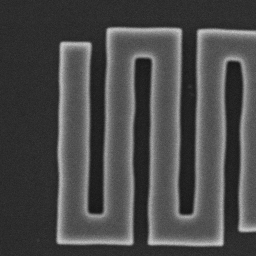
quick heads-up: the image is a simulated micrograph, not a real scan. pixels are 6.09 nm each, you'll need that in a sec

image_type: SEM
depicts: groups of lines, slits or small figures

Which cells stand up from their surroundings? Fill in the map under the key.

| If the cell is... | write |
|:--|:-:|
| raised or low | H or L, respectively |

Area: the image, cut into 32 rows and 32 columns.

LLLLLLLLLLLLLLLLLLLLLLLLLLLLLLLL
LLLLLLLLLLLLLLLLLLLLLLLLLLLLLLLL
LLLLLLLLLLLLLLLLLLLLLLLLLLLLLLLL
LLLLLLLLLLLLLLLLLLLLLLLLLLLLLLLL
LLLLLLLLLLLLLHHHHHHHHHHLLHHHHHHH
LLLLLLLLHHHLLHHHHHHHHHHLLHHHHHHH
LLLLLLLLHHHLLHHHHHHHHHHLLHHHHHHH
LLLLLLLLHHHLLHHHHLLHHHHLLHHHHHHH
LLLLLLLLHHHLLHHHHLLHHHHLLHHHLLHH
LLLLLLLLHHHLLHHHHLLHHHHLLHHHLLHH
LLLLLLLLHHHLLHHHHLLHHHHLLHHHLLHH
LLLLLLLLHHHLLHHHHLLHHHHLLHHHLLHH
LLLLLLLLHHHLLHHHHLLHHHLLLHHHLLHH
LLLLLLLLHHHLLHHHHLLHHHLLLHHHLLHH
LLLLLLLLHHHLLHHHHLLHHHLLLHHHLLHH
LLLLLLLLHHHLLHHHHLLHHHLLLHHHLLHH
LLLLLLLLHHHLLHHHHLLHHHLLLHHHLLHH
LLLLLLLHHHHLLHHHHLLHHHLLLHHHLLHH
LLLLLLLHHHHLLHHHHLLHHHLLLHHHLLHH
LLLLLLLHHHHLLHHHHLLHHHLLLHHHLLHH
LLLLLLLHHHHLLHHHHLLHHHLLLHHHLLHH
LLLLLLLLHHHLLHHHHLLHHHLLLHHHLLHH
LLLLLLLLHHHLLHHHHLLHHHLLLHHHLLHH
LLLLLLLLHHHLLHHHHLLHHHLLHHHHLLHH
LLLLLLLHHHHLLHHHHLLHHHLLHHHHLLHH
LLLLLLLHHHHLLHHHHLLHHHLLHHHHLLHH
LLLLLLLHHHHLLHHHHLLHHHLLHHHHLLHH
LLLLLLLHHHHHHHHHHLLHHHHHHHHHLLHH
LLLLLLLHHHHHHHHHLLLHHHHHHHHHLLHH
LLLLLLLHHHHHHHHHHLLHHHHHHHHHLLLL
LLLLLLLLLLLLLLLLLLLLLLHHHHHHLLLL
LLLLLLLLLLLLLLLLLLLLLLLLLLLLLLLL